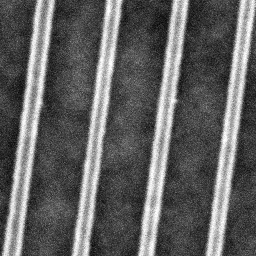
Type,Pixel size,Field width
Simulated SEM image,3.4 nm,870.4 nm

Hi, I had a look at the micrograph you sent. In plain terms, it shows one or a few lines or trenches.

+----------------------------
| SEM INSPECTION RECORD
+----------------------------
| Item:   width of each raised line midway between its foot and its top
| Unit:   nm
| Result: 36.6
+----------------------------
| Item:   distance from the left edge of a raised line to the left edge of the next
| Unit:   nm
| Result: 227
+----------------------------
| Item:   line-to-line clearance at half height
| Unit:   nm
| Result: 191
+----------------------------